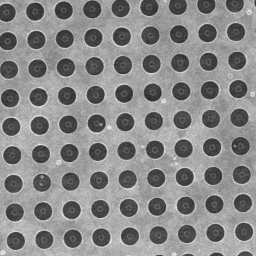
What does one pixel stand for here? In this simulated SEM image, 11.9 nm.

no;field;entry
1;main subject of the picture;an array of small figures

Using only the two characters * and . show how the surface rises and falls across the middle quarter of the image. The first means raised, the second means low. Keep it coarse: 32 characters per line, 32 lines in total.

...**.....**.....***....***....*
...**.....***....***....***....*
..****...*****.*****************
********************************
********************************
*******..*****..*****...***....*
...***....***....***....***.....
...**.....***....***.....**.....
...***....***....***....****...*
...***...*****..****************
********************************
********************************
**************..*****...****...*
...***....***....***.....**.....
...***.....**.....**.....**.....
...***....***.....**....****...*
...***....****...*****.*********
********************************
********************************
***************.*****...****....
...****...****....***....***....
....**.....**.....**.....***....
....**.....**.....***....***....
...****...****...*****..********
*.******************************
********************************
**********************..*****...
...****...****....***....***....
....***....***....***....***....
....***....***....***....***....
....***....***....****..*****..*
...*****************************